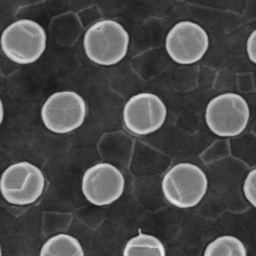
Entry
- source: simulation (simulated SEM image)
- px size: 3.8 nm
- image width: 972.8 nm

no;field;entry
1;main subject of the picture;a regular array of raised bodies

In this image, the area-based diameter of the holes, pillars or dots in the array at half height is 162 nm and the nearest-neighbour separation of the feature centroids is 0.307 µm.